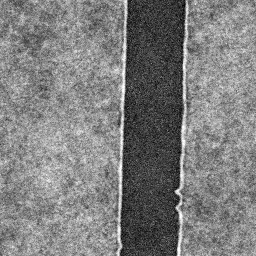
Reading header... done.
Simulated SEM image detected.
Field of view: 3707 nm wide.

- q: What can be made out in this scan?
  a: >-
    one or a few lines or trenches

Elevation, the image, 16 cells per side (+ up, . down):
++++++++....++++
++++++++....++++
++++++++....++++
++++++++....++++
++++++++....++++
++++++++....++++
++++++++....++++
++++++++...+++++
++++++++...+++++
++++++++...+++++
++++++++...+++++
++++++++...+++++
+++++++....+++++
+++++++....+++++
+++++++....+++++
+++++++....+++++